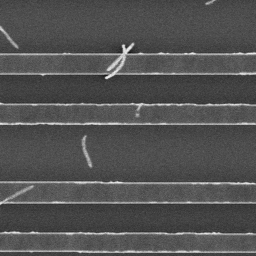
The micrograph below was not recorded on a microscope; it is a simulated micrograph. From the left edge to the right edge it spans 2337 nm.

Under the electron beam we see lines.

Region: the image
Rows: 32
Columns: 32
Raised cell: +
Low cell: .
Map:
................................
................................
................................
................................
................................
................................
...............+................
++++++++++++++++++++++++++++++++
++++++++++++++++++++++++++++++++
.............+..................
................................
................................
................................
++++++++++++++++++++++++++++++++
++++++++++++++++++++++++++++++++
................................
................................
................................
................................
................................
................................
................................
................................
++++++++++++++++++++++++++++++++
++++++++++++++++++++++++++++++++
................................
................................
................................
................................
++++++++++++++++++++++++++++++++
++++++++++++++++++++++++++++++++
................................